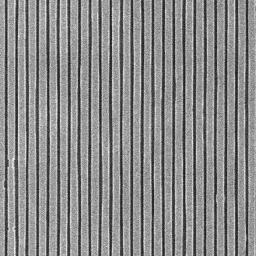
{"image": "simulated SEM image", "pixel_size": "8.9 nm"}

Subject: parallel lines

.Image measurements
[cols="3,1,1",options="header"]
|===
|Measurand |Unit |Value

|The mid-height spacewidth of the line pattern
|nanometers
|25.6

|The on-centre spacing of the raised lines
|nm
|93.1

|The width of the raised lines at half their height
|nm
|66.8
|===